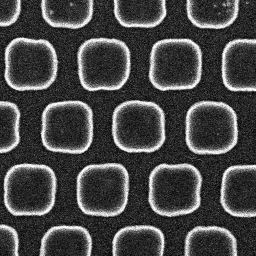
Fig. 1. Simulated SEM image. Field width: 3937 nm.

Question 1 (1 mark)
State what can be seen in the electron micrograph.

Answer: a regular array of raised bodies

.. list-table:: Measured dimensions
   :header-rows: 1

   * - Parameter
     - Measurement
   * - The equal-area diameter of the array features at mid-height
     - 815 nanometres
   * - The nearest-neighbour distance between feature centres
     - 1.1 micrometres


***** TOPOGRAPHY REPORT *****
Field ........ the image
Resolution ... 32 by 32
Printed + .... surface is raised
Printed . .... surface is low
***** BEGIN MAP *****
++...++++++...++++++....++++++..
++...++++++...+++++++...++++++..
++....+++++....+++++....+++++...
................................
................................
.+++++.....++++.....++++.....+++
.++++++...++++++...++++++...++++
.++++++...++++++...++++++...++++
.++++++...++++++...++++++...++++
.++++++...++++++...++++++...++++
.+++++....+++++....+++++....++++
................................
................................
++....+++++....+++++....+++++...
++....+++++...++++++...++++++...
++....+++++...++++++...++++++...
++...++++++...++++++...++++++...
++...++++++...++++++...++++++...
+.....+++++....+++++....+++++...
................................
................................
.+++++....++++++...++++++...++++
.++++++...++++++...++++++...++++
.++++++...++++++...++++++...++++
.++++++...++++++...++++++...++++
.++++++...++++++...++++++...++++
..++++.....++++.....+++......+++
................................
+......+++.......++......++.....
++....+++++....+++++....+++++...
++...++++++...++++++...++++++...
++...++++++...++++++...++++++...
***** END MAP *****